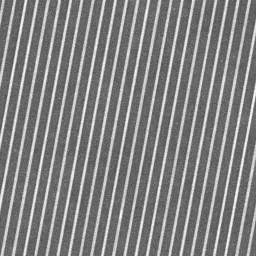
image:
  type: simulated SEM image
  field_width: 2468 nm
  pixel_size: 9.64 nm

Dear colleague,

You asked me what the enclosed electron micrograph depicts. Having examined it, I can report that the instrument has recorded parallel lines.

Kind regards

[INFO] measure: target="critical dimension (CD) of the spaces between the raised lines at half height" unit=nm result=83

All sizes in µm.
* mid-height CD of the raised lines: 0.0178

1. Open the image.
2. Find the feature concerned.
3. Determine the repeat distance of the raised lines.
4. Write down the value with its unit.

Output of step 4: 106 nm